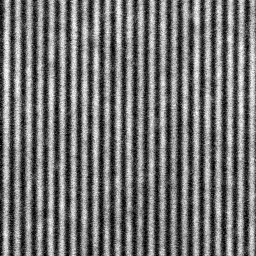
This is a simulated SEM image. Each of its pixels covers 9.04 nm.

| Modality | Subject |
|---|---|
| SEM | parallel lines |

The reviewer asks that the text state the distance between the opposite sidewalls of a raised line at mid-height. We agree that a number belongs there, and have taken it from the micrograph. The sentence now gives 33.9 nm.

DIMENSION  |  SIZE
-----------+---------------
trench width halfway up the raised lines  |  67.8 nanometres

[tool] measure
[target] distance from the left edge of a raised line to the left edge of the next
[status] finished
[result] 101 nm